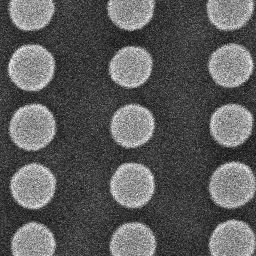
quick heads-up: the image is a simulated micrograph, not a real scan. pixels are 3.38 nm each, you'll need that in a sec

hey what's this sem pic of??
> a regular array of raised bodies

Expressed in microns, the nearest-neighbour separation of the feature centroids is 0.201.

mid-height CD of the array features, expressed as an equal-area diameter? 42.9 px